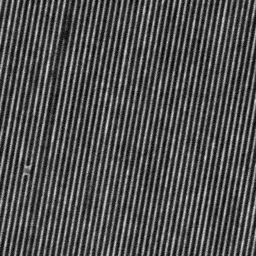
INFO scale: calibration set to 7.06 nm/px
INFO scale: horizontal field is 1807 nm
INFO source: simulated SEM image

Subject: parallel lines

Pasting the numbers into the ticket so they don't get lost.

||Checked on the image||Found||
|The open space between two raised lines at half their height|33.1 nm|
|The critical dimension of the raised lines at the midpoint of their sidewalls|6.9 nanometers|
